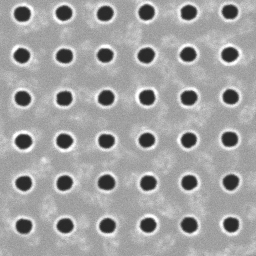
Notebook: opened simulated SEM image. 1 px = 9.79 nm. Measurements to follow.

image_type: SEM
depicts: a regular array of holes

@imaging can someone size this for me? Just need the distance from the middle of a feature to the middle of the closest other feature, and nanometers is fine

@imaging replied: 403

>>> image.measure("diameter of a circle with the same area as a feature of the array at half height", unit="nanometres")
166